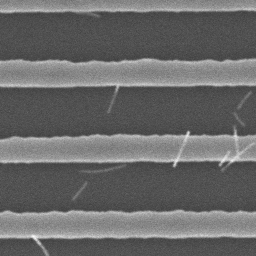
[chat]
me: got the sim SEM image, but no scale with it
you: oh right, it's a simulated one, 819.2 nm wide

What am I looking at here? lines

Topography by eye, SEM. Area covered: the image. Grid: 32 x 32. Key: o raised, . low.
oooooooooooooooooooooooooooooooo
................................
................................
................................
................................
................................
................................
.................oo............o
oooooooooooooooooooooooooooooooo
oooooooooooooooooooooooooooooooo
oooooooooooooooooooooooooooooooo
................................
................................
................................
................................
................................
................................
oooooooooooooooooooooooooooooooo
oooooooooooooooooooooooooooooooo
oooooooooooooooooooooooooooooooo
................................
................................
................................
................................
................................
................................
.........o....o...o..oo...oo....
oooooooooooooooooooooooooooooooo
oooooooooooooooooooooooooooooooo
oooooooooooooooooooooooooooooooo
................................
................................